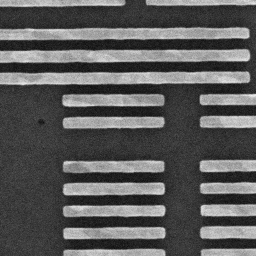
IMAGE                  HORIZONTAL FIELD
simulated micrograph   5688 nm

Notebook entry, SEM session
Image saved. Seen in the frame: wiring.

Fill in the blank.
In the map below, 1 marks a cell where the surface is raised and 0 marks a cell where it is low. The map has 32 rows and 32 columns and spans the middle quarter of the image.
00000000000000000000000000000000
00000000000000000000000000000000
11111111111111111111111111111111
11111111111111111111111111111111
11111111111111111111111111111111
00000000000000000000000000000000
00000000000000000000000000000000
00000000000000000000000000000000
11111111111111111111111110000000
11111111111111111111111110000000
01111100000000000000000000000000
00000000000000000000000000000000
00000000000000000000000000000000
01111111111111111111111110000000
11111111111111111111111110000000
11111111111111111111111100000000
00000000000000000000000000000000
00000000000000000000000000000000
00000000000000000000000000000000
00000000000000000000000000000000
00000000000000000000000000000000
00000000000000000000000000000000
00000000000000000000000000000000
00000000000000000000000000000000
00000000000000000011111000000000
11111111111111111111111110000000
11111111111111111111111110000000
00000000000000000000000000000000
00000000000000000000000000000000
00000000000000000000000000000000
11111111111111111111111110000000
11111111111111111111111110000000